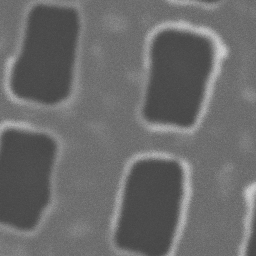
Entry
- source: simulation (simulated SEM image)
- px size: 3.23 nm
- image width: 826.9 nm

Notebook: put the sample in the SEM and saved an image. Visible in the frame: holes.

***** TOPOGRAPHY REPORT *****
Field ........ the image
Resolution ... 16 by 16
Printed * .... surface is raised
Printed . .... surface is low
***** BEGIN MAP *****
**..************
**...***********
*....*****...***
*....****....***
*....****....***
*....****....***
***.*****....***
*********...****
...*************
....************
...*****...*****
...*****...*****
...*****...*****
...****....*****
*******....*****
********...****.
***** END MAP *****